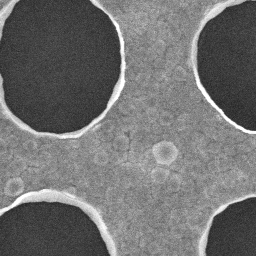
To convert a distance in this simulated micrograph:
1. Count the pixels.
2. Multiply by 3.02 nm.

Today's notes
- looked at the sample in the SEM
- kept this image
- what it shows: holes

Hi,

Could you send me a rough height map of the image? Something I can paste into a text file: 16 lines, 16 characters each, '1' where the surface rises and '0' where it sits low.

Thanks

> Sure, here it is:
1000001111111100
0000000111111000
0000000111110000
0000000011110000
0000000011110000
0000000111111000
0000000111111000
1000001111111100
1111111111111111
1111111111111111
1111111111111111
1111111111111111
1100111111111110
0000001111111000
0000001111111000
0000000111111000